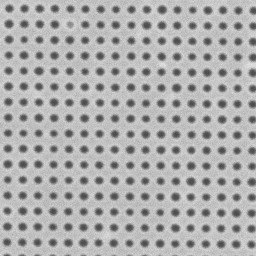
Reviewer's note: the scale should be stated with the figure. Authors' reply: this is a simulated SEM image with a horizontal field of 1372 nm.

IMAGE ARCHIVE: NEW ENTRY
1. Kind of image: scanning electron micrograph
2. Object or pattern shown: a regular array of holes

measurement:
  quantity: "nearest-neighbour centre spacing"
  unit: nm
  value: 80.9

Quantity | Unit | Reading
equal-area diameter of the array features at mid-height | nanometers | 47.3